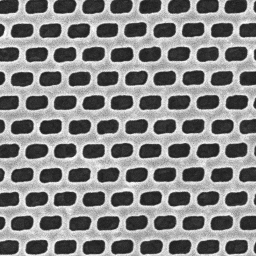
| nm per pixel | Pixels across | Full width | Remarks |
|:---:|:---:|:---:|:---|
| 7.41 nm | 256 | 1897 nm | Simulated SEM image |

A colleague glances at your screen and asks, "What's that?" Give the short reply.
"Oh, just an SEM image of a regular array of holes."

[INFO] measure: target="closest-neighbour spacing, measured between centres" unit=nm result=205